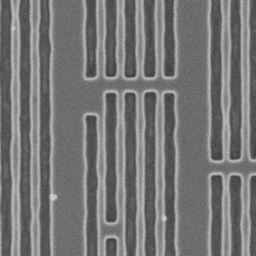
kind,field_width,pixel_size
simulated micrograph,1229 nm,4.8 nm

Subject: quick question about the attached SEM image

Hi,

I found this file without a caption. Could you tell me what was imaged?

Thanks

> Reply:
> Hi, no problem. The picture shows groups of lines, slits or small figures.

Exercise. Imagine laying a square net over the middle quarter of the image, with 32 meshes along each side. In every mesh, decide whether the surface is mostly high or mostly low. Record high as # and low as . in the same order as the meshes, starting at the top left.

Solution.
#####...##...##...##...##...####
#####...##...##...##...##...####
#####...##...##...##...##...####
######..###.###...###.##########
################################
################################
################################
##########...##...##...##...####
##########...##...##...##...####
##########...##...##...##...####
##########...##...##...##...####
##########...##...##...##...####
##########...##...##...##...####
#####...##...##...##...##...####
#####...##...##...##...##...####
#####...##...##...##...##...####
#####...##...##...##...##...####
#####....#...##...##...##...####
#####....#...##...##...##...####
#####....#...##...##...##...####
#####....#...##...##...##...####
#####....#...##...##...##...####
#####....#...##...##...##...####
#####....#...##...##...##...####
#####...##...##...##...##...####
######..##...##...##...##...####
######..##...##...##...##...####
#####....#...##...##...##...####
#####....#...##...##...##...####
#####....#...##...##...##...####
#####....#...##...##...##...####
#####....#...##...##...##...####